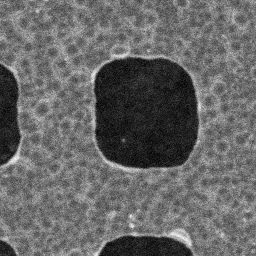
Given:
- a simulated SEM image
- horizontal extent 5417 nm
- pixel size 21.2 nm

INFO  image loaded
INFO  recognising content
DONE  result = holes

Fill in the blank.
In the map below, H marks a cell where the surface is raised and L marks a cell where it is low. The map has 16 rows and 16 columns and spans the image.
HHHHHHHHHHHHHHHH
HHHHHHHHHHHHHHHH
HHHHHHHHHHHHHHHH
HHHHHHHHHHHHHHHH
LHHHHHLLLLLLHHHH
LHHHHHLLLLLLHHHH
LHHHHHLLLLLLHHHH
LHHHHHLLLLLLHHHH
LHHHHHLLLLLLHHHH
LHHHHHLLLLLLHHHH
HHHHHHHHLLHHHHHH
HHHHHHHHHHHHHHHH
HHHHHHHHHHHHHHHH
HHHHHHHHHHHHHHHH
HHHHHHHHHHHHHHHH
LHHHHHLLLLLLHHHH